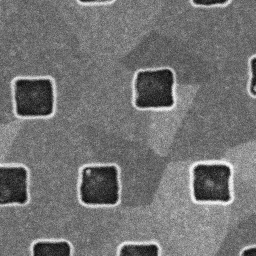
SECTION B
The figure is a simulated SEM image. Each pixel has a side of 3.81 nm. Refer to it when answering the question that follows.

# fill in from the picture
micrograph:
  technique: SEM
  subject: holes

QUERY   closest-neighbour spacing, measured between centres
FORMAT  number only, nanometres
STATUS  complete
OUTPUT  419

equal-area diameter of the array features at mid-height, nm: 167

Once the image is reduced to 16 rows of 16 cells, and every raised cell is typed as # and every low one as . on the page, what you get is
################
################
################
################
#########..#####
#..#####...#####
#..######..#####
################
################
################
.####..#####..##
..###..#####..##
..###..#####..##
################
################
##..####..######